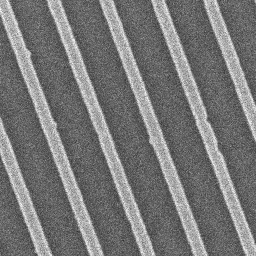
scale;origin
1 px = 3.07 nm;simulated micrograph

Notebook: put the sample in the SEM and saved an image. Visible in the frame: parallel lines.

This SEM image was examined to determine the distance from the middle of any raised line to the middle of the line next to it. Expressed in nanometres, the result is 149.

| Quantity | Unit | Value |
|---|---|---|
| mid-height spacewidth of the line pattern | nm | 114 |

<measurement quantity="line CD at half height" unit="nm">34.1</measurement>